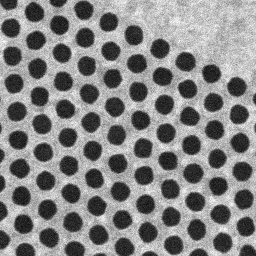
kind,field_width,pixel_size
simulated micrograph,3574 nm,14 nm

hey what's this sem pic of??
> a regular array of holes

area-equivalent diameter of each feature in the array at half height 288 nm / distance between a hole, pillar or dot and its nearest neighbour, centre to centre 0.388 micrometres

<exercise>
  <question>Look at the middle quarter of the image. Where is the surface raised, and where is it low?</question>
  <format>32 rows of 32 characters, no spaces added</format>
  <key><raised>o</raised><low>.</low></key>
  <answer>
ooo.....oooooooo.....ooooooo....
ooo.....ooo...oo....ooo....oo...
.ooo...ooo....oooo.ooo.....ooooo
..oooooooo.....ooooooo.....ooooo
..oooooooo.....oo..ooo.....oo...
..oo....oo....oo.....ooo..oo....
.ooo.....ooooooo.....ooooooo....
oooo.....ooooooo.....oooooooo...
oooo.....oo...oo.....oo....ooo..
..ooo...oo.....ooo.oooo.....oooo
...ooooooo.....ooooooo......oooo
...ooooooo.....ooo.oooo....ooo..
...ooo..ooo....oo....ooo..ooo...
..oo.....oooooooo.....ooooooo...
oooo.....oooooooo.....ooooooo...
oooo.....ooo...oo....ooo...ooo..
...oo...ooo....ooo..ooo.....oooo
...oooooooo.....ooooooo.....oooo
...ooooooo......ooo.ooo.....oo..
...ooo...oo....ooo....oo...oo...
..ooo.....ooo.ooo.....ooooooo...
ooooo.....ooooooo.....oooooooo..
ooooo....oooo..oo.....oo....oo..
...oo....oo....oooo..oo......ooo
....ooooooo.....ooooooo......ooo
....ooooooo.....ooo..ooo....oo..
....oo...ooo...ooo....ooo..ooo..
...oo.....ooooooo.....oooooooo..
ooooo.....oooooooo.....ooooooo..
ooooo.....ooo..ooo....oo....ooo.
...ooo....oo....oooooooo.....ooo
....ooooooo......ooooooo.....ooo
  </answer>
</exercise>